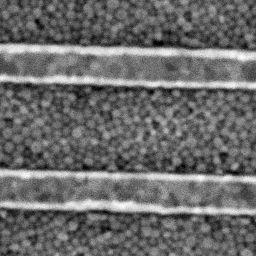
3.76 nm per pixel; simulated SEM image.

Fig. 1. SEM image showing one or a few lines or trenches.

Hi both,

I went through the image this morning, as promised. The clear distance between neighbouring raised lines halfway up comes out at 349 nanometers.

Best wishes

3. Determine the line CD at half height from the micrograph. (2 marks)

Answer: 122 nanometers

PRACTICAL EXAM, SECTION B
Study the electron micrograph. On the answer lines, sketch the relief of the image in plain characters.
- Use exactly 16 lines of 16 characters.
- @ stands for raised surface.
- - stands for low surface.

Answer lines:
----------------
----------------
----------------
@@@@@@@@@@@@@@@@
@@@@@@@@@@@@@@@@
----------------
----------------
----------------
----------------
----------------
----------------
@@@@@@@@@@@@@@@@
@@@@@@@@@@@@@@@@
----------------
----------------
----------------